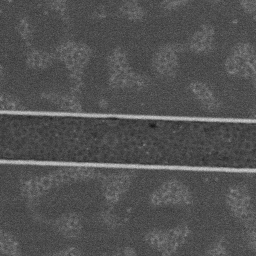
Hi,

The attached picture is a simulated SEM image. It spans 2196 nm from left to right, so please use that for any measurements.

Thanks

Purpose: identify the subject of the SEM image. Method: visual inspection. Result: one or a few lines or trenches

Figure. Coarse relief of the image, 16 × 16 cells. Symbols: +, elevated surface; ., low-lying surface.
++++++++++++++++
++++++++++++++++
++++++++++++++++
++++++++++++++++
++++++++++++++++
++++++++++++++++
++++++++++++++++
..............++
................
................
++++++++++++....
++++++++++++++++
++++++++++++++++
++++++++++++++++
++++++++++++++++
++++++++++++++++